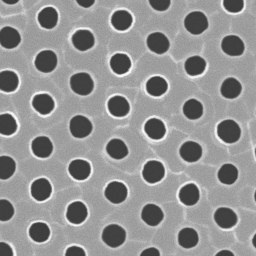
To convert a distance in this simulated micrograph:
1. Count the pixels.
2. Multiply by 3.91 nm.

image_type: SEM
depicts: a regular array of holes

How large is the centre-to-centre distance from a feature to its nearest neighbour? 42.4 pixels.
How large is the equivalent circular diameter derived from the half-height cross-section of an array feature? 83.9 nanometers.